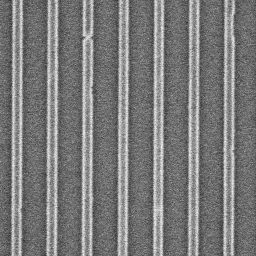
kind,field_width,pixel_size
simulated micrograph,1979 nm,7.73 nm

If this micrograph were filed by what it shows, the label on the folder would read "parallel lines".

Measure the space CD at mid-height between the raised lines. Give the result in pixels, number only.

27.5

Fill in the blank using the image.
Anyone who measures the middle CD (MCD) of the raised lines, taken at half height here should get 60.9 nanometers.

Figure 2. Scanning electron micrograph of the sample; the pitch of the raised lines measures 0.273 micrometres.